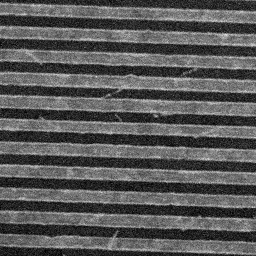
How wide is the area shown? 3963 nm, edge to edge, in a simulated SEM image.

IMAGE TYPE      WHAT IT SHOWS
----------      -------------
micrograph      parallel lines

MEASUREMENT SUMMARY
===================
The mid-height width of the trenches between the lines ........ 186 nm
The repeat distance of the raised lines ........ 357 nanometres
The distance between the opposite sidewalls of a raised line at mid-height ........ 170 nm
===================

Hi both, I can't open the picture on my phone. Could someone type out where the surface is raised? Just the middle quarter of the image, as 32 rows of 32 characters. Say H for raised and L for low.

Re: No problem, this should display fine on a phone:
LLLLLLLLLLLLLLLLLLLLLLLLLLLLLHHH
LLLLLLLLLLLLLLLLLLLLLLLLLLLLLLLL
LLLLLLLLLLLLLLLLLLLLLLLLLLLLLLLL
HHHHHHHHHHHHHHHHHHHHHHHHLLLLLLLL
HHHHHHHHHHHHHHHHHHHHHHHHHHHHHHHH
LHHHHLHHHHHHHHHHHHHHHHHHHHHHHHHH
LLLLLLLLLLLLLLLLLLLLLLLLLLLLLLLH
LLLLLLLLLLLLLLLLLLLLLLLLLLLLLLLL
HLLLLLLLLLLLLLLLLLLLLLLLLLLLLLLL
HHHHHHHHHHHHHHHHHHHHHHHHHLLLLHHH
HHHHHHHHHHHHHHHHHHHHHHHHHHHHHHHH
LLLLLLLLLHHHHHHHHHHHHHHHHHHHHHHH
LLLLLLLLLLLLLLLLLLLLLLLLLHHLLLLL
LLLLLLLLLLLLLLLLLLLLLLLLLLLLLLLL
HHLLLLLLLLLLLLLLLLLLLLLLLLLLLLLL
HHHHHHHHHHHHHHHHHHHHHHHHHHHHHHHH
HHHHHHHHHHHHHHHHHHHHHHHHHHHHHHHH
LLLLLLLLLLLLLLLLLLHHLLLLHHHHHHHH
LLLLLLLLLLLLLLLLLLLLLLLLLLLLLLLL
LLLLLLLLLLLLLLLLLLLLLLLLLLLLLLLL
HHHHHHHHHHHHLLHHLLLLLLLLLLLLLLLL
HHHHHHHHHHHHHHHHHHHHHHHHHHHHHHHH
HHHHHHHHHHHHHHHHHHHHHHHHHHHHHHHH
LLLLLLLLLLLLLLLLLLLLLLLLLLLLLLLH
LLLLLLLLLLLLLLLLLLLLLLLLLLLLLLLL
LLLLLLLLLLLLLLLLLLLLLLLLLLLLLLLL
HHHHHHHHHHHHHHHHHHLLLLLLLLLLLLLL
HHHHHHHHHHHHHHHHHHHHHHHHHHHHHHHH
LLHHHHHHHHHHHHHHHHHHHHHHHHHHHHHH
LLLLLLLLLLLLLLLLLLLLLLLLLLLLLLLL
LLLLLLLLLLLLLLLLLLLLLLLLLLLLLLLL
LLLLLLLLLLLLLLLLLLLLLLLLLLLLLLLL